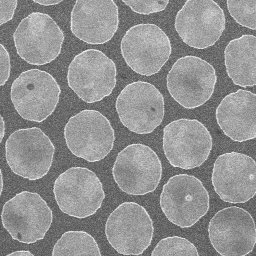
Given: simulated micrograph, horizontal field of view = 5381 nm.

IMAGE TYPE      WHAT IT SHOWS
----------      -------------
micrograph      a regular array of raised bodies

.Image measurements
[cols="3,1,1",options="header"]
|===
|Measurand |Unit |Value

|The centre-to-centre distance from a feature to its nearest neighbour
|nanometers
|1190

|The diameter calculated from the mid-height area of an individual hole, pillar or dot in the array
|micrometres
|1.04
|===